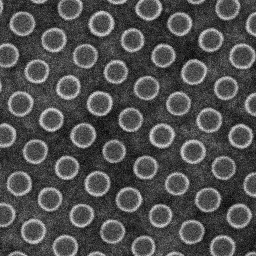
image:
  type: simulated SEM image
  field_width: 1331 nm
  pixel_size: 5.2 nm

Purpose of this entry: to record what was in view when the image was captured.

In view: a regular array of raised bodies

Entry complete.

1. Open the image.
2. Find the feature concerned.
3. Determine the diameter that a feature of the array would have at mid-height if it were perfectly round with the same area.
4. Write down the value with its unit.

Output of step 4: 0.119 µm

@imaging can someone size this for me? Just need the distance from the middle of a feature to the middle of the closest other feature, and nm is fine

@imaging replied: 182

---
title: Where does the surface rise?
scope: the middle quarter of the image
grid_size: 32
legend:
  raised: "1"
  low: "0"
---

00001110000111100000000010000011
00000000000111110000000000000011
00000000001111110000000000000011
11100000000111100000110000000011
11110000000011000011111000000001
11110000000000000011111100000000
11110000000000000011111100000000
11100000111000000011111000011100
00000011111100000001110000111110
00000011111100000000000000111110
00000011111100000000000000111110
00000011111000011100000000111110
00000000110000111110000000001100
00000000000000111110000000000000
00000000000000111110000000000000
00011110000000111110000111000000
00111110000000001100001111100000
00111111000000000000001111100000
00111111000000000000001111100000
00111110000111000000001111100001
00001100001111100000000010000011
00000000001111100000000000000011
00000000001111100000000000000011
11000000001111100001110000000011
11100000000010000011111000000001
11100000000000000011111000000000
11100000000000000011111000000000
11100001110000000011111000011000
10000011111000000000100000111110
00000011111000000000000000111110
00000011111000000000000000111110
00000011111000011100000000111100